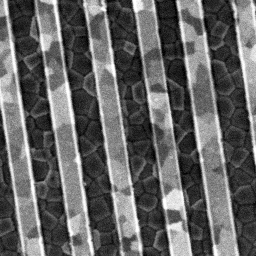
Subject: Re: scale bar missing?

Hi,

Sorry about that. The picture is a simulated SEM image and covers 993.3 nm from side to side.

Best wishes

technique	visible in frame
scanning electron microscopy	parallel lines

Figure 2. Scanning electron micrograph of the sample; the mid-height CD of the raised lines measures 71.9 nm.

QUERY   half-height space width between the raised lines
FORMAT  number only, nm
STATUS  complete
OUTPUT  117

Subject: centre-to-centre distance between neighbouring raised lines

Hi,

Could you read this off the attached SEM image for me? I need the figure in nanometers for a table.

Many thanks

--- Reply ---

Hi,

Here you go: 185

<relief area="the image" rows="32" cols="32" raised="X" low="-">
X----XX----XX----XX---XXX----XXX
X----XX----XX----XX---XXX----XXX
X----XX----XX----XXX---XX----XXX
X----XX----XX----XXX---XX-----XX
X----XX----XXX---XXX---XXX----XX
X----XXX---XXX----XX---XXX----XX
XX---XXX----XX----XX---XXX----XX
XX----XX----XX----XX---XXX----XX
XX----XX----XX----XXX--XXX----XX
XX----XX----XX----XXX---XX-----X
XX----XX----XX----XXX---XX-----X
XX----XXX---XXX----XX---XXX----X
XX----XXX---XXX----XX---XXX----X
XXX----XX----XX----XX---XXX----X
XXX----XX----XX----XX---XXX----X
-XX----XX----XX----XXX---XX----X
-XX----XX----XX----XXX---XX-----
-XX----XX----XXX---XXX---XX-----
-XX----XXX---XXX----XX---XXX----
-XXX---XXX----XX----XX---XXX----
-XXX----XX----XX----XX---XXX----
--XX----XX----XX----XX---XXX----
--XX----XX----XX----XXX---XX----
--XX----XX----XX----XXX---XX----
--XX----XX----XXX---XXX---XXX---
--XX----XXX---XXX----XX---XXX---
--XXX---XXX----XX----XX---XXX---
--XXX----XX----XX----XX---XXX---
---XX----XX----XX----XX---XXX---
---XX----XX----XX----XXX---XX---
---XX----XX----XXX---XXX---XX---
---XX----XXX---XXX---XXX---XXX--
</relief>